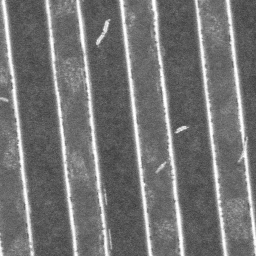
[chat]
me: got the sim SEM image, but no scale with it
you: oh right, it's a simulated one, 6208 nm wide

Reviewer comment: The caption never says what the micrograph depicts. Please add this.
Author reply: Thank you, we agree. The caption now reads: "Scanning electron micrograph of one or a few lines or trenches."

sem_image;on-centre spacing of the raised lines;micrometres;1.8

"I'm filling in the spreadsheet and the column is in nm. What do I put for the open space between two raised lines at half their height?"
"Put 1030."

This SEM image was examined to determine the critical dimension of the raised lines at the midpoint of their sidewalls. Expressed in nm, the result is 759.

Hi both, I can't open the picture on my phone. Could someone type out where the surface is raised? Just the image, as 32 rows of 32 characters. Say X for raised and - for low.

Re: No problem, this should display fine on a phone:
------XXXX-----XXXX------XXXX---
X-----XXXX-----XXXX------XXXX---
X-----XXXX-----XXXX------XXXX---
X-----XXXX------XXX------XXXX---
X-----XXXX------XXXX-----XXXX---
X-----XXXX------XXXX-----XXXX---
X------XXXX-----XXXX-----XXXX---
X------XXXX-----XXXX-----XXXX---
X------XXXX-----XXXX------XXX---
XX-----XXXX-----XXXX------XXXX--
XX-----XXXX-----XXXX------XXXX--
XX-----XXXX-----XXXX------XXXX--
XX-----XXXX------XXXX-----XXXX--
XX-----XXXX------XXXX-----XXXX--
XX-----XXXX------XXXX-----XXXX--
XX------XXX------XXXX-----XXXX--
XX------XXXX-----XXXX-----XXXX--
XX------XXXX-----XXXX------XXX--
XXX-----XXXX-----XXXX------XXXX-
XXX-----XXXX-----XXXX------XXXX-
XXX-----XXXX-----XXXXX-----XXXX-
XXX-----XXXX------XXXX-----XXXX-
XXX-----XXXX------XXXX-----XXXX-
XXX------XXX------XXXX-----XXXX-
XXX------XXXX-----XXXX-----XXXX-
XXX------XXXX-----XXXX-----XXXX-
XXX------XXXX-----XXXX------XXX-
XXXX-----XXXX-----XXXX------XXXX
XXXX-----XXXX-----XXXX------XXXX
XXXX-----XXXX------XXXX-----XXXX
XXXX-----XXXX------XXXX-----XXXX
XXXX-----XXXX------XXXX-----XXXX